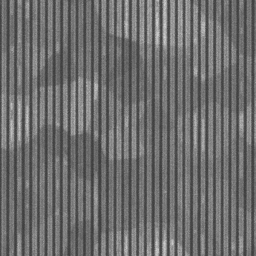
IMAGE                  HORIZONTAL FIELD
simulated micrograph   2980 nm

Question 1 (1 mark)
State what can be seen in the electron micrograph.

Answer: parallel lines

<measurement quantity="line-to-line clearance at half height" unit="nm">40.7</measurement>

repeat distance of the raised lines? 7.65 pixels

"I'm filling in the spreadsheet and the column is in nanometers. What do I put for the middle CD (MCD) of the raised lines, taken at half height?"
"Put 49.5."